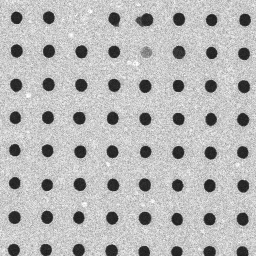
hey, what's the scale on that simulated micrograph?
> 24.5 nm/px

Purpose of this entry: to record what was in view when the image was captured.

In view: a regular array of holes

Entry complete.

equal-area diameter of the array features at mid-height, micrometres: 0.311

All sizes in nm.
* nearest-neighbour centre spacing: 793